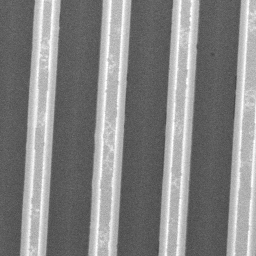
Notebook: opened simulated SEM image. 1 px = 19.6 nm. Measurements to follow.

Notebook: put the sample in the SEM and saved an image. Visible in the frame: one or a few lines or trenches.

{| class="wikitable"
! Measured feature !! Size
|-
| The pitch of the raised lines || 1.36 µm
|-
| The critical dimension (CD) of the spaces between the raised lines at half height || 993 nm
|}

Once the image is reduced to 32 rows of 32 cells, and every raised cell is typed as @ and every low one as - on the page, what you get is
-----@@------@@@------@@-------@
-----@@------@@@------@@-------@
-----@@------@@@------@@-------@
-----@@------@@@------@@-------@
-----@@------@@@------@@------@@
-----@@------@@-------@@------@@
-----@@------@@-------@@------@@
----@@@------@@-------@@------@@
----@@-------@@-------@@------@@
----@@-------@@-------@@------@@
----@@-------@@-------@@------@@
----@@-------@@-------@@------@@
----@@-------@@-------@@------@@
----@@-------@@------@@@------@@
----@@-------@@------@@-------@@
----@@-------@@------@@-------@@
----@@------@@@------@@-------@@
----@@------@@@------@@-------@@
----@@------@@@------@@-------@@
----@@------@@@------@@-------@@
----@@------@@@------@@-------@@
----@@------@@@------@@------@@@
----@@------@@@------@@------@@@
----@@------@@-------@@------@@@
---@@@------@@-------@@------@@@
---@@@------@@-------@@------@@@
---@@-------@@-------@@------@@@
---@@-------@@-------@@------@@@
---@@-------@@-------@@------@@@
---@@-------@@-------@@------@@-
---@@-------@@------@@@------@@-
---@@-------@@------@@@------@@-